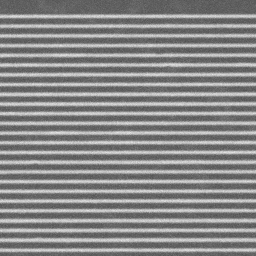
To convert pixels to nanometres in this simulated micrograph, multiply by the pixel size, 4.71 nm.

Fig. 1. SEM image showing parallel lines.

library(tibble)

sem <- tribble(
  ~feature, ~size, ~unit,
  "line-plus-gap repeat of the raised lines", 45.8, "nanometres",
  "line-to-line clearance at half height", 32.9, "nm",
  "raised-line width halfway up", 12.9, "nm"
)